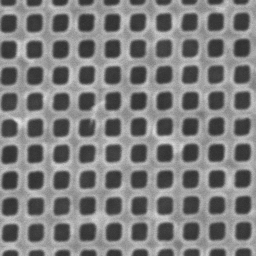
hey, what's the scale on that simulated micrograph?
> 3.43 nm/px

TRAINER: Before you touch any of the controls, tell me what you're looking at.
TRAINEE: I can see a regular array of holes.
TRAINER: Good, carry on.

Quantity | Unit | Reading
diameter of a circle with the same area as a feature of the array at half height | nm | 66.8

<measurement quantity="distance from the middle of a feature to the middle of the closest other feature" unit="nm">88.2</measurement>